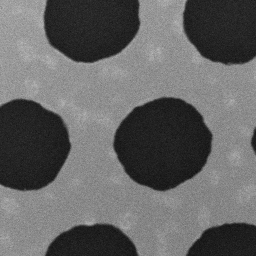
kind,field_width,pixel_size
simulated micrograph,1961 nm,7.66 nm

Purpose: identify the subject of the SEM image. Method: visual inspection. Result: holes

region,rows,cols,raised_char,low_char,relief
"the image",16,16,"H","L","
HHHLLLLLLHHHLLLL
HHHLLLLLLHHLLLLL
HHHLLLLLHHHHLLLL
HHHHLLLHHHHHHLLL
HHHHHHHHHHHHHHHH
HHHHHHHHHHHHHHHH
LLHHHHHHHLLLHHHH
LLLLHHHHLLLLLHHH
LLLLHHHLLLLLLHHH
LLLLHHHLLLLLLHHH
LLLLHHHHLLLLLHHH
LLLHHHHHHLLHHHHH
HHHHHHHHHHHHHHHH
HHHHHHHHHHHHHHHH
HHHHLLLLHHHHHLLL
HHHLLLLLHHHHLLLL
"